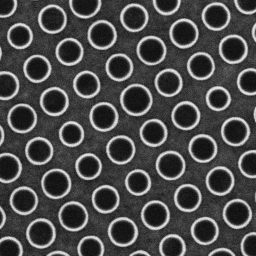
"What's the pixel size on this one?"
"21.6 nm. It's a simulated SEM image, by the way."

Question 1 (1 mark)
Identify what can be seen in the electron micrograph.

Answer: a regular array of raised bodies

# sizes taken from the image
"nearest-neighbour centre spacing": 36.4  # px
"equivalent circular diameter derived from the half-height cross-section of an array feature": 575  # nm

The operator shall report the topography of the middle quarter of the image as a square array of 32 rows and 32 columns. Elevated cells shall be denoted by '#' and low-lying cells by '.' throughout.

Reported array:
...........######..............#
...........######..............#
....###....#####........####....
...#####....####.......######...
...######..............######...
...######........##....######...
...######......######...#####...
....####.......######....##.....
#.............########..........
#.............########..........
#.......####...#######......####
.......######..######.......####
.......######....##........#####
.......######..............#####
.......######........###...#####
####....####........#####...####
####.....##........######.......
#####..............######.......
#####........###....#####.......
####........#####...#####.......
...........######...............
...........#######.............#
...........######........###....
....####....#####.......#####...
...######....###.......#######..
...######..............#######..
...######..............#######..
#...#####.......####....#####...
#....##.........#####....###....
#...............#####...........
#...............#####.........##
#.......#####...#####.......####